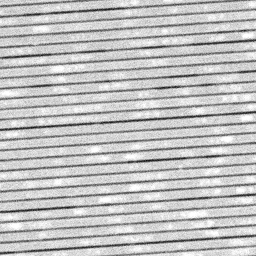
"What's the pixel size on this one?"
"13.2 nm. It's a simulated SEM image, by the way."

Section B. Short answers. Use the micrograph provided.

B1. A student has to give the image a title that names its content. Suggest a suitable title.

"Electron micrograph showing parallel lines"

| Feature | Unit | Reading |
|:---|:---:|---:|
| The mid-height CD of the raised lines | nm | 100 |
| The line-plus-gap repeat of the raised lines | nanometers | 135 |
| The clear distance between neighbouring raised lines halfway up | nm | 37.7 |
